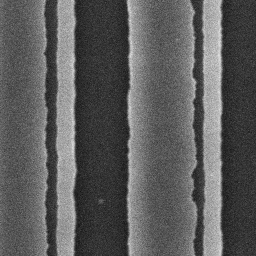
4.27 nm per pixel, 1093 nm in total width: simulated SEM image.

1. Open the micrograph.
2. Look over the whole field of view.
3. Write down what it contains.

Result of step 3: lines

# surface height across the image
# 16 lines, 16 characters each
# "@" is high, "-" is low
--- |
@@@@@---@@@@@@--
@@@@@---@@@@@@--
@@@@@---@@@@@@--
@@@@@---@@@@@@--
@@@@@---@@@@@@--
@@@@@---@@@@@@--
@@@@@---@@@@@@--
@@@@@---@@@@@@--
@@@@@---@@@@@@--
@@@@@---@@@@@@--
@@@@@---@@@@@@--
@@@@@---@@@@@@--
@@@@@---@@@@@@--
@@@@@---@@@@@@--
@@@@@---@@@@@@--
@@@@@---@@@@@@--